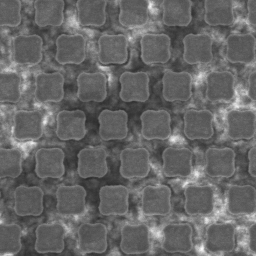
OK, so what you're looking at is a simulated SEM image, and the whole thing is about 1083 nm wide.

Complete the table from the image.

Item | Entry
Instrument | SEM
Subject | a regular array of raised bodies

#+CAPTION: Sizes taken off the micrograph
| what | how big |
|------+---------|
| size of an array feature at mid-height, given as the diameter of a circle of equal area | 132 nanometers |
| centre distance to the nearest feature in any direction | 180 nm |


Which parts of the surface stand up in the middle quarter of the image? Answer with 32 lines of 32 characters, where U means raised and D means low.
DDDDDDDDDDDDDDDDDDDDDDDDDDDDDDDD
DDDDDDDDDDDDDDDDDDDDDDDDDDDDDDDD
DDDDUUUUUUDDDDDUUUUUDDDDDUUUUUUD
DDDDUUUUUUDDDDUUUUUUUDDDDUUUUUUU
DDDUUUUUUUDDDDUUUUUUUDDDDUUUUUUU
DDDDUUUUUUDDDDUUUUUUUDDDDUUUUUUU
DDDDUUUUUUDDDDUUUUUUUDDDDUUUUUUU
DDDDUUUUUUDDDDUUUUUUUDDDDUUUUUUU
DDDDUUUUUUDDDDUUUUUUUDDDDUUUUUUD
DDDDDDDDDDDDDDDDDDDDDDDDDDDDDDDD
DDDDDDDDDDDDDDDDDDDDDDDDDDDDDDDD
DDDDDDDDDDDDDDDDDDDDDDDDDDDDDDDD
UUUUUDDDDUUUUUUUDDDDUUUUUUDDDDUU
UUUUUDDDDUUUUUUUDDDUUUUUUUDDDDUU
UUUUUDDDDUUUUUUUDDDDUUUUUUDDDDUU
UUUUUDDDDUUUUUUUDDDDUUUUUUDDDDUU
UUUUUDDDDUUUUUUUDDDUUUUUUUUDDDUU
UUUUUDDDDUUUUUUUDDDDUUUUUUUDDDUU
UUUUUDDDDUUUUUUDDDDDUUUUUUDDDDDU
DDDDDDDDDDDDDDDDDDDDDDDDDDDDDDDD
DDDDDDDDDDDDDDDDDDDDDDDDDDDDDDDD
DDDDUUUUUUDDDDDUUUUUUDDDDUUUUUUD
DDDDUUUUUUUDDDUUUUUUUDDDDUUUUUUU
DDDDUUUUUUUDDDUUUUUUUDDDDUUUUUUU
DDDDUUUUUUUDDDUUUUUUUDDDDUUUUUUU
DDDDUUUUUUUDDDUUUUUUUDDDDUUUUUUU
DDDDUUUUUUUDDDUUUUUUUDDDDUUUUUUU
DDDDUUUUUUDDDDUUUUUUUDDDDUUUUUUD
DDDDDDDDDDDDDDDDDDDDDDDDDDDDDDDD
DDDDDDDDDDDDDDDDDDDDDDDDDDDDDDDD
DDUUDDDDDDDDDDDDDDDDDDDDDDDDDDDD
UUUUUDDDDUUUUUUUDDDDUUUUUUDDDDUU